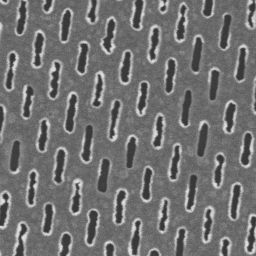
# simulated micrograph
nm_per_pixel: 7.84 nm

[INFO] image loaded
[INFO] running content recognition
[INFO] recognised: a regular array of holes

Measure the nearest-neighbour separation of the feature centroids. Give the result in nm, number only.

266